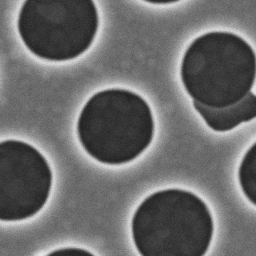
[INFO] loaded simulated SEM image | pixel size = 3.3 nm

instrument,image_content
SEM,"holes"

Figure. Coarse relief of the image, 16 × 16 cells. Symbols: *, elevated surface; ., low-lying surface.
*.....**********
*.....**********
*.....******...*
**...******.....
***********.....
************....
*****....***....
*****.....***...
*****.....******
..***....******.
...************.
...************.
...******....***
..******.....***
********.....***
****.****....***